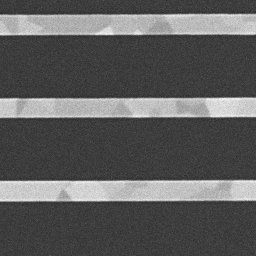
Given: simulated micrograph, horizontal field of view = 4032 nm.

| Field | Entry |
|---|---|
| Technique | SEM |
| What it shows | one or a few lines or trenches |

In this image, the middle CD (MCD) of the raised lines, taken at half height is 0.309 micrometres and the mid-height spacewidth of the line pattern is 1.01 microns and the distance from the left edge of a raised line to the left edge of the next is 1310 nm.